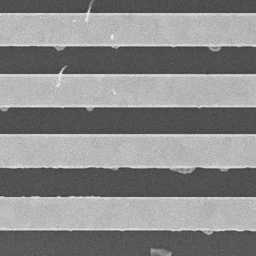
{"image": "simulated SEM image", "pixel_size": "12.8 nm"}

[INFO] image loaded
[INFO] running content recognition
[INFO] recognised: lines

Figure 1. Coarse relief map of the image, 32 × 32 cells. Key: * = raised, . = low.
................................
................................
********************************
********************************
********************************
********************************
................................
................................
................................
********************************
********************************
********************************
********************************
................................
................................
................................
................................
********************************
********************************
********************************
********************************
................................
................................
................................
................................
********************************
********************************
********************************
********************************
................................
................................
................................